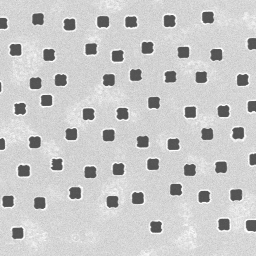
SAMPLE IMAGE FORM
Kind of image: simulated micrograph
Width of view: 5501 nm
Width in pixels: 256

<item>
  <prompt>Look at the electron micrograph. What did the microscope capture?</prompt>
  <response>a regular array of holes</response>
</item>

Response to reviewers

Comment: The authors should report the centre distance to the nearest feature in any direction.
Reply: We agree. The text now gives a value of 592 nm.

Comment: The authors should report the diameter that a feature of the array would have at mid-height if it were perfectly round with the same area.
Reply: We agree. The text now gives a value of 276 nanometers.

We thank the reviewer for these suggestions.